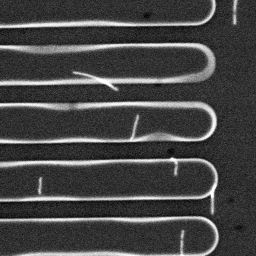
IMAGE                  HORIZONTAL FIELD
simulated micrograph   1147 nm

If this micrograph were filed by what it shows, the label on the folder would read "groups of lines, slits or small figures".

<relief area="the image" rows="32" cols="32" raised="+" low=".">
+++++++++++++++++++++++++++.....
+++++++++++++++++++++++++++.....
++++++++++++++++++++++++++......
................................
................................
................................
++++++++++++++++++++++++++......
++++++++++++++++++++++++++......
++++++++++++++++++++++++++......
+++++++++++++++++++++++++.......
................................
................................
................................
++++++++++++++++++++++++++......
+++++++++++++++++++++++++++.....
+++++++++++++++++++++++++++.....
++++++++++++++++++++++++++......
+++++++++++++++++......++.......
................................
................................
.+++++++++++++++++++++++++......
+++++++++++++++++++++++++++.....
+++++++++++++++++++++++++++.....
+++++++++++++++++++++++++++.....
++++++++++++++++++++++++++......
................................
................................
++++++++++++++++++++++++++......
+++++++++++++++++++++++++++.....
+++++++++++++++++++++++++++.....
+++++++++++++++++++++++++++.....
++++++++++++++++++++++++++......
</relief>